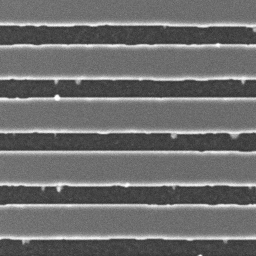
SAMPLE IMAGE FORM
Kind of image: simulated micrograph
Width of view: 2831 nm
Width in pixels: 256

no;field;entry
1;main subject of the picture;lines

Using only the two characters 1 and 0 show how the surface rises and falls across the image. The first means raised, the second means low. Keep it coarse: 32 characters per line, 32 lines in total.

11111111111111111111111111111111
11111111111111111111111111111111
11111111111111111111111111111111
00000000000000000000000000000000
00000000000000000000000000000000
00000000000000000000000000010000
11111111111111111111111111111111
11111111111111111111111111111111
11111111111111111111111111111111
11111111111111111111111111111111
00000000000000000000000000000000
00000000000000000000000000000000
11111111111111111111111111111111
11111111111111111111111111111111
11111111111111111111111111111111
11111111111111111111111111111111
11111111111111111111111111111111
00000000000000000000000000000000
00000000000000000000000000000000
11111111111111111111111111111111
11111111111111111111111111111111
11111111111111111111111111111111
11111111111111111111111111111111
00000000000000000000000000000000
00000000000000000000000000000000
00000000000000000000000000000000
11111111111111111111111111111111
11111111111111111111111111111111
11111111111111111111111111111111
11111111111111111111111111111111
00000000000000000000000000000000
00000000000000000000000000000000